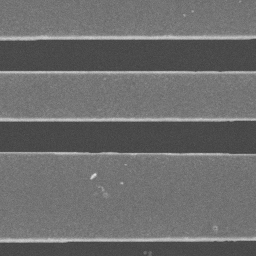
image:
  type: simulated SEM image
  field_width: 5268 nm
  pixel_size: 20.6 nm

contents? lines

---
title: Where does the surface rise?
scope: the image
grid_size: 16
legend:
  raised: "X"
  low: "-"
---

XXXXXXXXXXXXXXXX
XXXXXXXXXXXXXXXX
----------------
----------------
XXXXXXXXXXXXXXXX
XXXXXXXXXXXXXXXX
XXXXXXXXXXXXXXXX
XXXXXXXXXXXXXXXX
----------------
----------------
XXXXXXXXXXXXXXXX
XXXXXXXXXXXXXXXX
XXXXXXXXXXXXXXXX
XXXXXXXXXXXXXXXX
XXXXXXXXXXXXXXXX
----------------